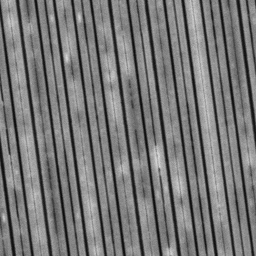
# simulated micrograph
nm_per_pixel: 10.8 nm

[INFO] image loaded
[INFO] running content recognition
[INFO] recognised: parallel lines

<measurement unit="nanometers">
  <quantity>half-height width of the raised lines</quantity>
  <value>74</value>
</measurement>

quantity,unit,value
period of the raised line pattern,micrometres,0.0988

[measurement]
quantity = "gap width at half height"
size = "32.2 nm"